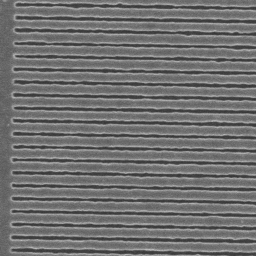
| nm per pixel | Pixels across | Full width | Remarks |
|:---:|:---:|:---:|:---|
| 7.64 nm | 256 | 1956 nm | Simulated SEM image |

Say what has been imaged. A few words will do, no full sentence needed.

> parallel lines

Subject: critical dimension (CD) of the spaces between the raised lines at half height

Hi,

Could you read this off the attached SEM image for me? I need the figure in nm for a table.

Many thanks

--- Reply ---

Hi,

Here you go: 26.7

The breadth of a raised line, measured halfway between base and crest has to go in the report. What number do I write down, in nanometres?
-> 73.5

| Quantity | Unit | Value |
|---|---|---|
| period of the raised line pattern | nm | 98.7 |